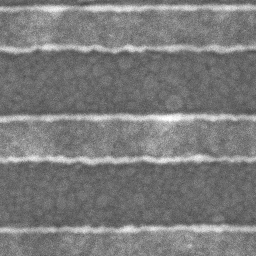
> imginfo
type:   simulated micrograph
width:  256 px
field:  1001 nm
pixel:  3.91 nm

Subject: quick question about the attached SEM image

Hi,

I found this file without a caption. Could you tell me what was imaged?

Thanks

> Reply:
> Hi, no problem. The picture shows one or a few lines or trenches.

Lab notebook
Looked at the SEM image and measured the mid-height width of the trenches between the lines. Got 265 nm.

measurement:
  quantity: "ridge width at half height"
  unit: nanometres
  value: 168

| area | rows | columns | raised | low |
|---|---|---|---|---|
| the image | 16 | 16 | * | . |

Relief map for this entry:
.***************
****************
****************
................
................
................
................
****************
****************
****************
................
................
................
................
****************
****************